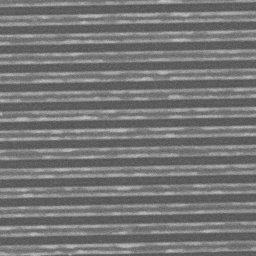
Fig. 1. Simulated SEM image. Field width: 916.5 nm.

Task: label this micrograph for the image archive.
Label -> parallel lines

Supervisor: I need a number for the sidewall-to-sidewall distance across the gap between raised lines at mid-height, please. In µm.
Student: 0.0331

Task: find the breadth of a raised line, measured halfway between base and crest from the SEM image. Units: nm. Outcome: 36.2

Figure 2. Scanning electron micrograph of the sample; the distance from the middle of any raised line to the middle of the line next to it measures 68.5 nanometers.